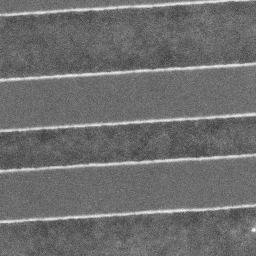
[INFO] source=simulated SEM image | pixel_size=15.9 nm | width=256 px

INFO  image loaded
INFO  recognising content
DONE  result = lines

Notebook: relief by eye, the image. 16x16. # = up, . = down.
#######.........
................
................
................
........########
################
################
############....
................
................
..##############
################
################
######..........
................
................